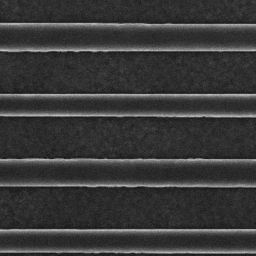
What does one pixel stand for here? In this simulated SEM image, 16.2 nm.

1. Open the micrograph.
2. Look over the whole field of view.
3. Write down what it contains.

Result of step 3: lines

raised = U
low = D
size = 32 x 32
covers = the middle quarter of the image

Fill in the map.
DDDDDDDDDDDDDDDDDDDDDDDDDDDDDDDD
DDDDDDDDDDDDDDDDDDDDDDDDDDDDDDDD
DDDDDDDDDDDDDDDDDDDDDDDDDDDDDDDD
DDDDDDDDDDDDDDDDDDDDDDDDDDDDDDDD
DDDDDDDDDDDDDDDDDDDDDDDDDDDDDDDD
DDDDDDDDDDDDDDDDDDDDDDDDDDDDDDDD
DDDDDDDDDDDDDDDDDDDDDDDDDDDDDDDD
DDDDDDDDDDDDDDDDDDDDDDDDDDDDDDDD
UUUUUUUUUUUUUUUUUUUUUUUUUUUUUUUU
UUUUUUUUUUUUUUUUUUUUUUUUUUUUUUUU
UUUUUUUUUUUUUUUUUUUUUUUUUUUUUUUU
UUUUUUUUUUUUUUUUUUUUUUUUUUUUUUUU
UUUUUUUUUUUUUUUUUUUUUUUUUUUUUUUU
DDDDDDDDDDDDDDDDDDDDDDDDDDDDDDDD
DDDDDDDDDDDDDDDDDDDDDDDDDDDDDDDD
DDDDDDDDDDDDDDDDDDDDDDDDDDDDDDDD
DDDDDDDDDDDDDDDDDDDDDDDDDDDDDDDD
DDDDDDDDDDDDDDDDDDDDDDDDDDDDDDDD
DDDDDDDDDDDDDDDDDDDDDDDDDDDDDDDD
DDDDDDDDDDDDDDDDDDDDDDDDDDDDDDDD
DDDDDDDDDDDDDDDDDDDDDDDDDDDDDDDD
DDDDDDDDDDDDDDDDDDDDDDDDDDDDDDDD
DDDDDDDDDDDDDDDDDDDDDDDDDDDDDDDD
DDDDDDDDDDDDDDDDDDDDDDDDDDDDDDDD
UUUUUUUUUUUUUUUUUUUUUUUUUUUUUUUU
UUUUUUUUUUUUUUUUUUUUUUUUUUUUUUUU
UUUUUUUUUUUUUUUUUUUUUUUUUUUUUUUU
UUUUUUUUUUUUUUUUUUUUUUUUUUUUUUUU
UUUUUUUUUUUUUUUUUUUUUUUUUUUUUUUU
UUUUUUUUUUUUUUUUUUUUUUUUUUUUUUUU
DDDDDDDDDDDDDDDDDDDDDDDDDDDDDDDD
DDDDDDDDDDDDDDDDDDDDDDDDDDDDDDDD